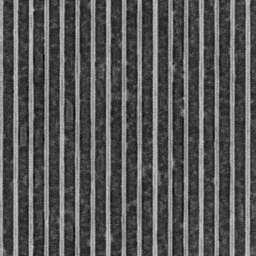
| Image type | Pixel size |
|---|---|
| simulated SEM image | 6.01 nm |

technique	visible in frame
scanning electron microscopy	parallel lines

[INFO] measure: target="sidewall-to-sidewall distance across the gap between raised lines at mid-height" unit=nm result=73.6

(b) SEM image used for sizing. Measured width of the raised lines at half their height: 21 nanometers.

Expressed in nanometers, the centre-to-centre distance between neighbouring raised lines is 93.